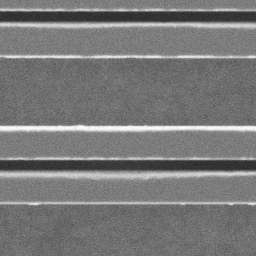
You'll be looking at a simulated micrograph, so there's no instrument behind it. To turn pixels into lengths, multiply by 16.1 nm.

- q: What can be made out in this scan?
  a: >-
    lines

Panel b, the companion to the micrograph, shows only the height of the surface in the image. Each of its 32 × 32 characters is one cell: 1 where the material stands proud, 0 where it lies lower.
11111111111111111111111111111111
00000000000000000000000000000000
00000000000000000000000000000000
11111111111111111111111111111111
11111111111111111111111111111111
11111111111111111111111111111111
11111111111111111111111111111111
00000000000000000000000000000000
00000000000000000000000000000000
00000000000000000000000000000000
00000000000000000000000000000000
00000000000000000000000000000000
00000000000000000000000000000000
00000000000000000000000000000000
00000000000000000000000000000000
00000000000000000000000000000000
11111111111111111111111111111111
11111111111111111111111111111111
11111111111111111111111111111111
11111111111111111111111111111111
00000000000000000000000000000000
10111001100000000000001111111111
11111111111111111111111111111111
11111111111111111111111111111111
11111111111111111111111111111111
00001000000000000000000000000000
00000000000000000000000000000000
00000000000000000000000000000000
00000000000000000000000000000000
00000000000000000000000000000000
00000000000000000000000000000000
00000000000000000000000000000000